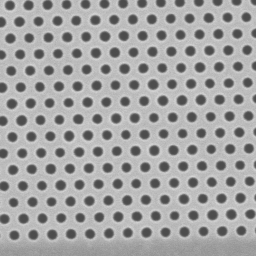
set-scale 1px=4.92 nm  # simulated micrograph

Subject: a regular array of holes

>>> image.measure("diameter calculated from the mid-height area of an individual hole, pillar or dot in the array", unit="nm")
48.7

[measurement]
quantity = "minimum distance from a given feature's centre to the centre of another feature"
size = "91.2 nanometers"